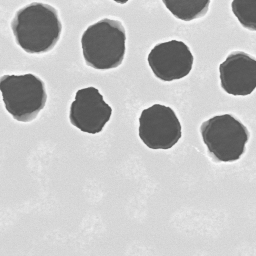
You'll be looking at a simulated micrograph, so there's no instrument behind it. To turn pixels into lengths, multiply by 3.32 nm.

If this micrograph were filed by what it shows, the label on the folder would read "holes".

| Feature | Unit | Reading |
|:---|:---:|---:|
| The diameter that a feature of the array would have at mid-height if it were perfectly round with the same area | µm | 0.147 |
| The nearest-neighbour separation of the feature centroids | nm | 224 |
